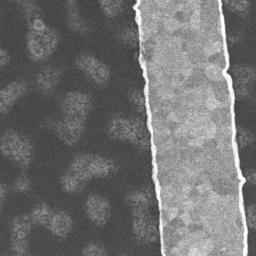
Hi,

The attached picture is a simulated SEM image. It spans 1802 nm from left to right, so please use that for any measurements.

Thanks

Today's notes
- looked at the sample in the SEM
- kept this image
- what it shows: one or a few lines or trenches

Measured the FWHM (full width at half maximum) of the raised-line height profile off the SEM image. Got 0.58 micrometres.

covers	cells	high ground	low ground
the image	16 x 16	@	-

---------@@@@@--
---------@@@@@--
---------@@@@@--
---------@@@@@--
---------@@@@@--
---------@@@@@--
---------@@@@@@-
---------@@@@@@-
---------@@@@@@-
----------@@@@@-
----------@@@@@-
----------@@@@@-
----------@@@@@-
----------@@@@@-
----------@@@@@-
----------@@@@@-